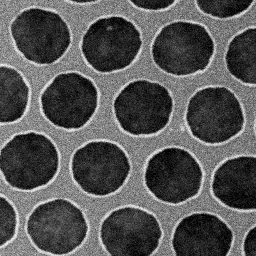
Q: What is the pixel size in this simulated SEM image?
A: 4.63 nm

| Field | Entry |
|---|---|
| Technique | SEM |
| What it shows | a regular array of holes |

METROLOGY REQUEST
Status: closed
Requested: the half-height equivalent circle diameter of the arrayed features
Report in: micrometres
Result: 0.271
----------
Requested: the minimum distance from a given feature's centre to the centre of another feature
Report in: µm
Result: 0.33